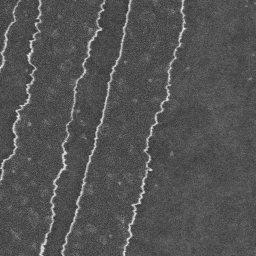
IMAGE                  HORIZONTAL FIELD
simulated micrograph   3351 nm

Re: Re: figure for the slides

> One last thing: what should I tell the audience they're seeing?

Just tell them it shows one or a few lines or trenches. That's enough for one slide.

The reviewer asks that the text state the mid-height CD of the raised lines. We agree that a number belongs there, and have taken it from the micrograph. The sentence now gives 732 nm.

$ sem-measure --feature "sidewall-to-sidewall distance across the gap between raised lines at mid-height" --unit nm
342